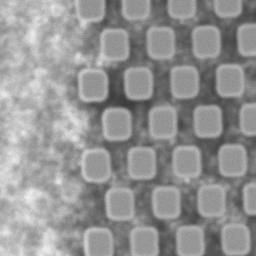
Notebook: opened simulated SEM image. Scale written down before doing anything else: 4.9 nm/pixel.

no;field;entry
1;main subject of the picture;a regular array of raised bodies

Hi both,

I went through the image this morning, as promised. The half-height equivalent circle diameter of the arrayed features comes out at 157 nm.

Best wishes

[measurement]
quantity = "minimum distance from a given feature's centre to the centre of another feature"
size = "0.222 µm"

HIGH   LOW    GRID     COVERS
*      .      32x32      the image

..........***..****..***...***..
..........***..****..***...***..
..........***...................
...................**....**...**
.............***..****..***...**
.............***..****..***...**
.............***..****..***...**
.............*..................
................**....**...***..
..........***...***..****..***..
..........***...***..****..***..
..........***...***...***..***..
...........**...................
...................**....**...**
.............***...***..****..**
.............***...***..****..**
.............***...***..****..**
................................
.................*....***...**..
..........****..***...***..****.
..........****..***...***..****.
..........****..***...***...***.
...........**...................
....................**...***...*
.............****..***...***...*
.............****..***...***...*
.............****..***...***...*
................................
.................**....**...***.
...........***..****..***...***.
...........***..****..***...***.
...........***..****..***...***.